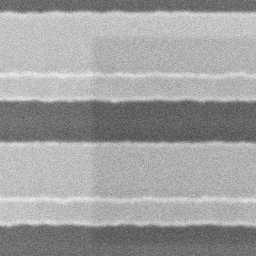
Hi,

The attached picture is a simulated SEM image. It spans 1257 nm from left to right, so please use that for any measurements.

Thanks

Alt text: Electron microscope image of lines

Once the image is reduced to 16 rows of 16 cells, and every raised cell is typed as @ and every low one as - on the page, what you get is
----------------
@@@@@@@@@@@@@@@@
@@@@@@@@@@@@@@@@
@@@@@@@@@@@@@@@@
@@@@@@@@@@@@@@@@
@@@@@@@@@@@@@@@@
----------------
----------------
----------------
@@@@@@@@@@@@@@@@
@@@@@@@@@@@@@@@@
@@@@@@@@@@@@@@@@
@@@@@@@@@@@@@@@@
@@@@@@@@@@@@@@@@
----------------
----------------